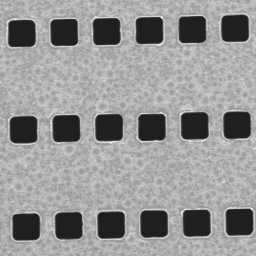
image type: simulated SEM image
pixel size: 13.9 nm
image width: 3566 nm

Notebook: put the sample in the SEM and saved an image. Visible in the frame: a regular array of holes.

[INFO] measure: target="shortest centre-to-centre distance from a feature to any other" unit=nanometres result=592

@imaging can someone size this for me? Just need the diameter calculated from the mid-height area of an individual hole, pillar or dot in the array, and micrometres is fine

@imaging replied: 0.416